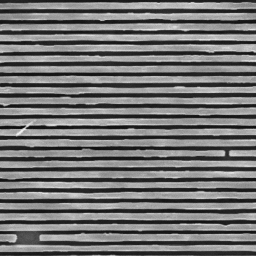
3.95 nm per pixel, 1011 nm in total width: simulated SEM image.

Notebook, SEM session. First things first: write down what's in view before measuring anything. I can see parallel lines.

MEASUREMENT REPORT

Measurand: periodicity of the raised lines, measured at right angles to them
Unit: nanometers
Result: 41.6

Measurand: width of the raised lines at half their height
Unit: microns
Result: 0.0256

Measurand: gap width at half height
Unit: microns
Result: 0.0148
